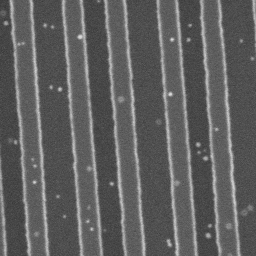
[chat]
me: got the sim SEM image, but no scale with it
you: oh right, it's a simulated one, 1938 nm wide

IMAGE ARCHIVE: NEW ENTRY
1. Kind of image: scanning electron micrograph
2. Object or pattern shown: lines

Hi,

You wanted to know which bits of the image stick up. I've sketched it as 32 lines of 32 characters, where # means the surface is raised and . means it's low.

.###....##...###....##...###....
.###....##...###....##...###....
.###....##...###....##...###....
.###....###..###....##...###....
..##....###...##....###..###....
..##....###...##....###..###....
..##....###...##....###...##....
..##....###...##....###...##....
..###....##...##....###...##....
..###....##...##....###...##....
..###....##...##....###...##....
..###....##...###....##...##....
..###....##...###....##...##....
..###....##...###....##...##....
..###....##...###....##...###...
..###....##...###....##...###...
...##....###..###....##...###...
...##....###..###....##...###...
...##....###...##....###..###...
...##....###...##....###..###...
...##....###...##....###...##...
...##....###...##....###...##...
...###...###...##....###...##...
...###....##...###...###...##...
...###....##...###...###...##...
...###....##...###....##...##...
...###....##...###....##...###..
#..###....##...###....##...###..
#..###....###..###....##...###..
#..###....###..###....##...###..
#...##....###..###....###..###..
#...##....###...##....###..###..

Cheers